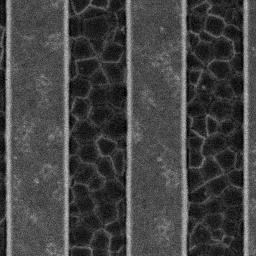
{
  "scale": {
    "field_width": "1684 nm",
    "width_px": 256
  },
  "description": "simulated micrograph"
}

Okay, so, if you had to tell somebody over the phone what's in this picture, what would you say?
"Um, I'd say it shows one or a few lines or trenches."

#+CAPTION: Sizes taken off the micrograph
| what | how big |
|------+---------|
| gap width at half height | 0.409 um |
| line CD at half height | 373 nm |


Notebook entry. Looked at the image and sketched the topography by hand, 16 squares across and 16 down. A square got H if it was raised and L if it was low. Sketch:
LHHHLLLLHHHLLLLH
LHHHLLLLHHHLLLLH
LHHHLLLLHHHLLLLH
LHHHLLLLHHHLLLLH
LHHHLLLLHHHLLLLH
LHHHLLLLHHHLLLLH
LHHHLLLLHHHLLLLH
LHHHLLLLHHHLLLLH
LHHHLLLLHHHLLLLH
LHHHLLLLHHHLLLLH
LHHHLLLLHHHHLLLH
LHHHLLLLHHHHLLLH
LHHHLLLLHHHHLLLH
LHHHLLLLHHHHLLLH
LHHHLLLLHHHHLLLH
LHHHLLLLHHHHLLLH